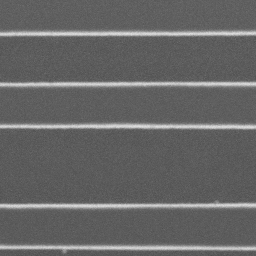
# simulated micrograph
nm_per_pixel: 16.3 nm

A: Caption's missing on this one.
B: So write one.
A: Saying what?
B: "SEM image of lines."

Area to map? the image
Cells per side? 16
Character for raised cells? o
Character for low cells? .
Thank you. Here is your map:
oooooooooooooooo
oooooooooooooooo
................
................
................
oooooooooooooooo
oooooooooooooooo
oooooooooooooooo
................
................
................
................
................
oooooooooooooooo
oooooooooooooooo
........oooooooo